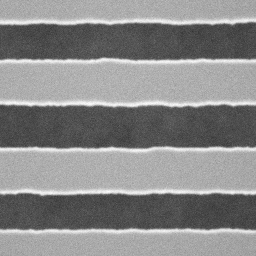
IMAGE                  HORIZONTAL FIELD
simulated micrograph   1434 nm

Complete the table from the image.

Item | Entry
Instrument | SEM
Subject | lines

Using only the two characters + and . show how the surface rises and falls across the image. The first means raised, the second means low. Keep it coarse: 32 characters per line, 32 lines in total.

++++++++++++++++++++++++++++++++
++++++++++++++++++++++++++++++++
++++++++++++++++++++++++++++++++
................................
................................
................................
................................
++++++++++++++++.......+++++++++
++++++++++++++++++++++++++++++++
++++++++++++++++++++++++++++++++
++++++++++++++++++++++++++++++++
++++++++++++++++++++++++++++++++
++++++++++++++++++++++++++++++++
................................
................................
................................
................................
................................
....+..............+++....++.++.
++++++++++++++++++++++++++++++++
++++++++++++++++++++++++++++++++
++++++++++++++++++++++++++++++++
++++++++++++++++++++++++++++++++
++++++++++++++++++++++++++++++++
................................
................................
................................
................................
................................
++++++++++++++++++++++++++++++++
++++++++++++++++++++++++++++++++
++++++++++++++++++++++++++++++++